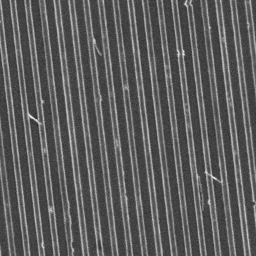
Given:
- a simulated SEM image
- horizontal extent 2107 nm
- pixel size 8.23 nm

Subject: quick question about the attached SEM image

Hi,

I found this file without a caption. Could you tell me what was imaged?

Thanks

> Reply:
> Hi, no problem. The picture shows parallel lines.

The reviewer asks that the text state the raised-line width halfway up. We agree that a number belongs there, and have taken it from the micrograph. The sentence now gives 44.9 nm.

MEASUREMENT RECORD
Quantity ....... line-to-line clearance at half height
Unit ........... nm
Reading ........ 75.6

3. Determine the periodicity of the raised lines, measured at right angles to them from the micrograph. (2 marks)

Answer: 120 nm